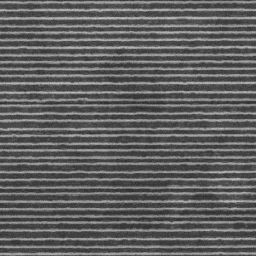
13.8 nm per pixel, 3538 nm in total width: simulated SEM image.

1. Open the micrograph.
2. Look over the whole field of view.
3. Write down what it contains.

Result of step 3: parallel lines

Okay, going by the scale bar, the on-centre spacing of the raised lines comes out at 204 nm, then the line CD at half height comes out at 8.76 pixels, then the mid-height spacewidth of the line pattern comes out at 81.2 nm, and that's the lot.